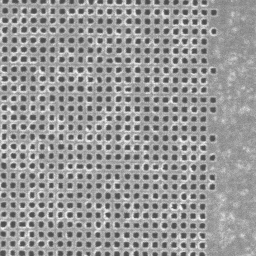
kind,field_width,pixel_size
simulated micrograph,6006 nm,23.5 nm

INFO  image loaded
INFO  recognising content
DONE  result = a regular array of holes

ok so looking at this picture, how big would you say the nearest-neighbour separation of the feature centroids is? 9.02 px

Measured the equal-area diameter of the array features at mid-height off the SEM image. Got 6.58 px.